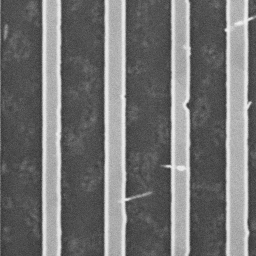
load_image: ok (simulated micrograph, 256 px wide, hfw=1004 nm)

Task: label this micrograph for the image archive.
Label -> one or a few lines or trenches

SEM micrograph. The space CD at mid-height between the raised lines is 0.184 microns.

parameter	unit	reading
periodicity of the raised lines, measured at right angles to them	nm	243